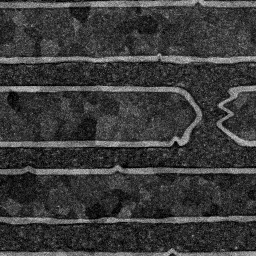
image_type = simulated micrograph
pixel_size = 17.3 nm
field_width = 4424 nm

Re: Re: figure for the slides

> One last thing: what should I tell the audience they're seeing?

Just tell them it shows one or a few lines or trenches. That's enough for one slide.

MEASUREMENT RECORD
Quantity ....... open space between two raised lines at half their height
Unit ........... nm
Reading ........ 536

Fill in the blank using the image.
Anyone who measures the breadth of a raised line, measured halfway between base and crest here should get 933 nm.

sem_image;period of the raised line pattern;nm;1420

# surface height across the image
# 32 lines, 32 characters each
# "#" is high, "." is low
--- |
...............#..#########.....
################################
################################
################################
################################
################################
################################
.##.............................
................................
................................
................................
#######################......###
########################.....###
########################....####
#########################...####
########################....####
#######################.....####
#######################.......##
................................
................................
................................
..###.#...###############.######
################################
################################
################################
################################
################################
.#....######..###.##............
................................
................................
................................
.....................#..........